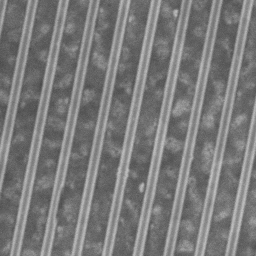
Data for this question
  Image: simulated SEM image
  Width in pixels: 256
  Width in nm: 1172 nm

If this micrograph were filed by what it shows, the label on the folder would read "parallel lines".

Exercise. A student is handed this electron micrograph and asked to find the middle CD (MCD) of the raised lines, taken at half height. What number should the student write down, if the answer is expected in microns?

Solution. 0.0338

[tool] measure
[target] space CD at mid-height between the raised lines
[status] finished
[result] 106 nanometers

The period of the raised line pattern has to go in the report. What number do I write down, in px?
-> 30.2